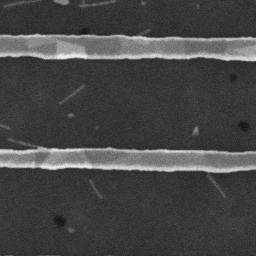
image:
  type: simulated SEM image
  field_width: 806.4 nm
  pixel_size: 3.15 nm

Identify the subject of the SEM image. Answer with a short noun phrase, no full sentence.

lines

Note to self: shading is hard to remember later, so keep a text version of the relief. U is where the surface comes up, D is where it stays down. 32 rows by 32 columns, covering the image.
DDDDDDDDDDDDDDDDDDDDDDDDDDDDDDDD
DDDDDDDDDDDDDDDDDDDDDDDDDDDDDDDD
DDDDDDDDDDDDDDDDDDDDDDDDDDDDDDDD
DDDDDDDDDDDDDDDDDDDDDDDDDDDDDDDD
UUUUUUUUDUUUDDUDDDDDDDDDDDDDDDDD
UUUUUUUUUUUUUUUUUUUUUUUUUUUUUUUU
UUUUUUUUUUUUUUUUUUUUUUUUUUUUUUUU
DDDDDDDDDDDDDDDDDDDDDDDDDDDDDDUU
DDDDDDDDDDDDDDDDDDDDDDDDDDDDDDDD
DDDDDDDDDDDDDDDDDDDDDDDDDDDDDDDD
DDDDDDDDDDDDDDDDDDDDDDDDDDDDDDDD
DDDDDDDDDDDDDDDDDDDDDDDDDDDDDDDD
DDDDDDDDDDDDDDDDDDDDDDDDDDDDDDDD
DDDDDDDDDDDDDDDDDDDDDDDDDDDDDDDD
DDDDDDDDDDDDDDDDDDDDDDDDDDDDDDDD
DDDDDDDDDDDDDDDDDDDDDDDDDDDDDDDD
DDDDDDDDDDDDDDDDDDDDDDDDDDDDDDDD
DDDDDDDDDDDDDDDDDDDDDDDDDDDDDDDD
DDDDDDDDDDDDDDDDDDDDDDDDDDDDDDDD
UUUUUUUUUUUUUUUUUUUUUUUUUUUUUUUU
UUUUUUUUUUUUUUUUUUUUUUUUUUUUUUUU
DDDDDDDDDDDDDDDDDDDDDDDDDDUUUDDD
DDDDDDDDDDDDDDDDDDDDDDDDDDDDDDDD
DDDDDDDDDDDDDDDDDDDDDDDDDDDDDDDD
DDDDDDDDDDDDDDDDDDDDDDDDDDDDDDDD
DDDDDDDDDDDDDDDDDDDDDDDDDDDDDDDD
DDDDDDDDDDDDDDDDDDDDDDDDDDDDDDDD
DDDDDDDDDDDDDDDDDDDDDDDDDDDDDDDD
DDDDDDDDDDDDDDDDDDDDDDDDDDDDDDDD
DDDDDDDDDDDDDDDDDDDDDDDDDDDDDDDD
DDDDDDDDDDDDDDDDDDDDDDDDDDDDDDDD
DDDDDDDDDDDDDDDDDDDDDDDDDDDDDDDD